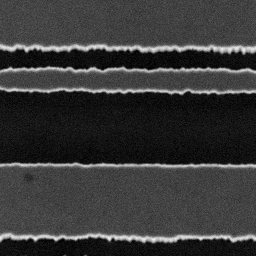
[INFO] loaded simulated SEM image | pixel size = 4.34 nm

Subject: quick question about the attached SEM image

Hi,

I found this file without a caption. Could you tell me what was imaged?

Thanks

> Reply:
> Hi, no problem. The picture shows lines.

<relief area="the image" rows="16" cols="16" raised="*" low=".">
****************
****************
****************
****************
****************
****************
................
................
................
................
****************
****************
****************
****************
****************
****************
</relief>